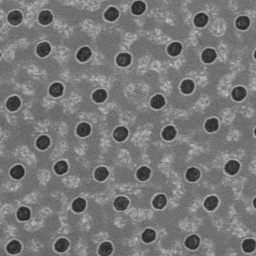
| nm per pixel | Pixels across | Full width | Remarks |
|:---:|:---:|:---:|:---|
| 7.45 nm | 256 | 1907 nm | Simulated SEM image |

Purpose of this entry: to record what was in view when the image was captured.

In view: a regular array of holes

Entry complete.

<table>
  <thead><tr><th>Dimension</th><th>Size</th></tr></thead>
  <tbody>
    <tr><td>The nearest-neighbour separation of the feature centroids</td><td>267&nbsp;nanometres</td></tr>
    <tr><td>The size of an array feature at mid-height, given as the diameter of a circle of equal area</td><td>116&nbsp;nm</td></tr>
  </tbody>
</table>